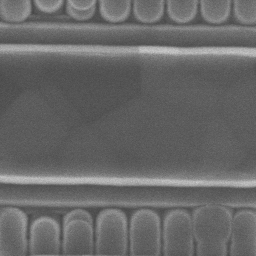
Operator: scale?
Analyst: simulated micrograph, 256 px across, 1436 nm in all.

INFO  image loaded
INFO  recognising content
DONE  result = wiring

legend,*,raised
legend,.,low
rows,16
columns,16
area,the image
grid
................
................
................
****************
****************
****************
****************
****************
****************
****************
****************
..............**
................
................
................
................